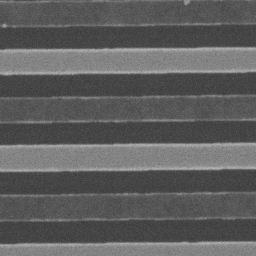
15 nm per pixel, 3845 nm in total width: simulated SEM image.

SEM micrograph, lines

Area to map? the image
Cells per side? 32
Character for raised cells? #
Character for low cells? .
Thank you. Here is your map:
################################
################################
################################
................................
................................
................................
################################
################################
################################
................................
................................
................................
################################
################################
################################
................................
................................
................................
################################
################################
################################
................................
................................
................................
################################
################################
################################
########........................
................................
................................
.............###################
################################